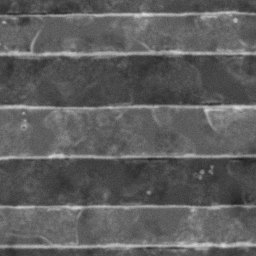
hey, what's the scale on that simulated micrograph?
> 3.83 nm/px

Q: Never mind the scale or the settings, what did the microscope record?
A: lines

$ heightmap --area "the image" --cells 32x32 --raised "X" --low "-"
--------------------------------
--------------------------------
XXXXXXXXXXXXXXXXXXXXXXXXXXXXXXXX
XXXXXXXXXXXXXXXXXXXXXXXXXXXXXXXX
XXXXXXXXXXXXXXXXXXXXXXXXXXXXXXXX
XXXXXXXXXXXXXXXXXXXXXXXXXXXXXXXX
XXXXXXXXXXXXXXXXXXXXXXXXXXXXXXXX
--------------------------------
--------------------------------
--------------------------------
--------------------------------
--------------------------------
--------------------------------
XXXXXXX------XXXXXXXXXXXXXXXXXXX
XXXXXXXXXXXXXXXXXXXXXXXXXXXXXXXX
XXXXXXXXXXXXXXXXXXXXXXXXXXXXXXXX
XXXXXXXXXXXXXXXXXXXXXXXXXXXXXXXX
XXXXXXXXXXXXXXXXXXXXXXXXXXXXXXXX
XXXXXXXXXXXXXXXXXXXXXXXXXXXXXXXX
XXXXXXXXXXXXXXXXXXXXXXX---------
--------------------------------
--------------------------------
--------------------------------
--------------------------------
--------------------------------
--------------------------------
XXXXXXXXXXXXXXXXXXXXXXXXXXXXXXXX
XXXXXXXXXXXXXXXXXXXXXXXXXXXXXXXX
XXXXXXXXXXXXXXXXXXXXXXXXXXXXXXXX
XXXXXXXXXXXXXXXXXXXXXXXXXXXXXXXX
XXXXXXXXXXXXXXXXXXXXXXXXXXXXXXXX
--------------------------------